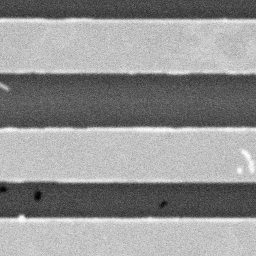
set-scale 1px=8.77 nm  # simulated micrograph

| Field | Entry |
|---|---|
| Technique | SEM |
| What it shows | lines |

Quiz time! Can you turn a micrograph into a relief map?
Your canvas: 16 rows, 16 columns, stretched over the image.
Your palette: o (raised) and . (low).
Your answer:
................
oooooooooooooooo
oooooooooooooooo
oooooooooooooooo
oooooooooooooooo
................
................
................
oooooooooooooooo
oooooooooooooooo
oooooooooooooooo
................
................
................
oooooooooooooooo
oooooooooooooooo